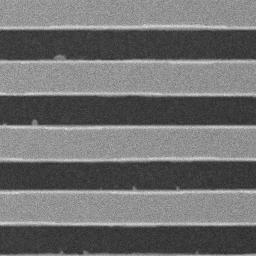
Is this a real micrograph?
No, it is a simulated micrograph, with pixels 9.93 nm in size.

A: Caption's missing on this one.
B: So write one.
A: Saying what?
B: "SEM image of lines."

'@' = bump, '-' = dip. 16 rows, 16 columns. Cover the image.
@@@@@@@@@@@@@@@@
@@@@@@@@@@@@@@@@
----------------
----------------
@@@@@@@@@@@@@@@@
@@@@@@@@@@@@@@@@
----------------
----------------
@@@@@@@@@@@@@@@@
@@@@@@@@@@@@@@@@
----------------
----------------
@@@@@@@@@@@@@@@@
@@@@@@@@@@@@@@@@
----------------
----------------